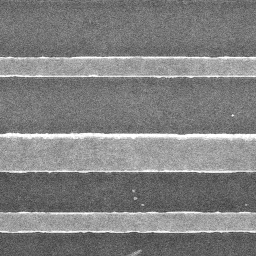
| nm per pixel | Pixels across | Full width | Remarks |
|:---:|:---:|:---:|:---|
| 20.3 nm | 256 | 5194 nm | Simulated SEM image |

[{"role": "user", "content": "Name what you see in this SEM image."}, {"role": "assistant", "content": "lines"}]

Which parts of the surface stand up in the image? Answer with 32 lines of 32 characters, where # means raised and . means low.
................................
................................
................................
................................
................................
................................
................................
################################
################################
################################
................................
................................
................................
................................
................................
................................
................................
################################
################################
################################
################################
.###......#.............######..
................................
................................
................................
................................
................................
################################
################################
................................
................................
................................